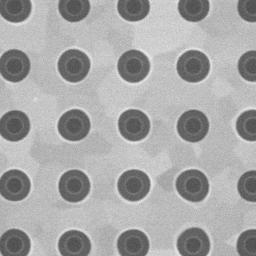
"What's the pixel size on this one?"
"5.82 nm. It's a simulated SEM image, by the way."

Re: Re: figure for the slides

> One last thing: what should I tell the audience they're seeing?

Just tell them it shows an array of small figures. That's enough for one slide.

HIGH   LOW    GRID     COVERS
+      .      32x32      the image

....+++....++++....+++....++++..
....+++....++++....+++....++++..
+..+++++..++++++..+++++..+++++..
++++++++++++++++++++++++++++++++
++++++++++++++++++++++++++++++++
++++++++++++++++++++++++++++++++
+..+++++...+++++..+++++..++++++.
....+++....++++....+++....++++..
....+++....++++....+++....++++..
...+++++...++++...++++....++++..
++++++++++++++++++++++++++++++++
++++++++++++++++++++++++++++++++
++++++++++++++++++++++++++++++++
+++++++++.++++++++++++++++++++++
...+++++...++++...+++++...++++..
....+++....++++....+++....+++...
....+++....++++....+++....+++...
+..+++++..++++++..+++++..+++++..
++++++++++++++++++++++++++++++++
++++++++++++++++++++++++++++++++
++++++++++++++++++++++++++++++++
+..+++++...++++...+++++..++++++.
....+++....++++....+++....++++..
....+++....++++....+++....++++..
...+++++...++++...++++....++++..
++++++++++++++++++++++++.+++++++
++++++++++++++++++++++++++++++++
++++++++++++++++++++++++++++++++
+++++++++++++++++++++++..+++++++
....++++...++++...++++....++++..
....+++.....++.....+++....++++..
....+++.....+++....+++....++++..